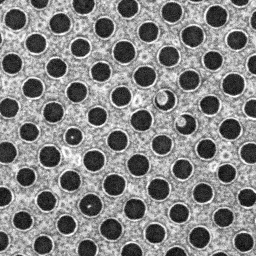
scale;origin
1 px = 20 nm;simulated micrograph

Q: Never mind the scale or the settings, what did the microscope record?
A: a regular array of holes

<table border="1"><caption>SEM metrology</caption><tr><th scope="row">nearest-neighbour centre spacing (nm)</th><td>622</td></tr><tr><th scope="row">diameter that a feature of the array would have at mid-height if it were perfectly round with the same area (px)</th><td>21.3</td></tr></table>